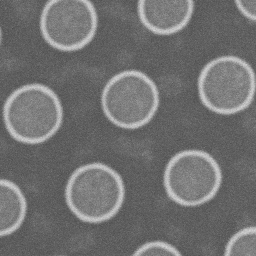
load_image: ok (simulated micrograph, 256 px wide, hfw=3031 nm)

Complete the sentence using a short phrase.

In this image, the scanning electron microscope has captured raised bodies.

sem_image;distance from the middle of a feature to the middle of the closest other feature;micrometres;1.16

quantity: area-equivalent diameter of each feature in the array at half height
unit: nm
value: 631